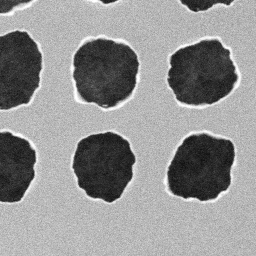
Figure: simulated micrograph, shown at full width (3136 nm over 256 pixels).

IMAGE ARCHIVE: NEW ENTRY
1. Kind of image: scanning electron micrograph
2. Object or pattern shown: holes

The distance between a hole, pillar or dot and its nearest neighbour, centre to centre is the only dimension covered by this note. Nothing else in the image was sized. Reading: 1150 nanometers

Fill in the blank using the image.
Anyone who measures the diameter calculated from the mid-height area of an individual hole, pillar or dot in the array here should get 0.836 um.